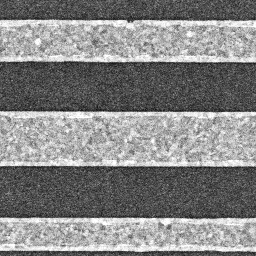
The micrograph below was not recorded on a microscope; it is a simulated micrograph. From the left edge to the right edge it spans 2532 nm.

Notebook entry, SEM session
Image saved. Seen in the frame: one or a few lines or trenches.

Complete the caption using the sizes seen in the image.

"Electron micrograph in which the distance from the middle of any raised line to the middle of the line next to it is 956 nanometers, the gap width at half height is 0.551 microns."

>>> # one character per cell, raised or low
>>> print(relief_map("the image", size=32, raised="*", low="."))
................................
................................
................................
********************************
********************************
********************************
********************************
.......................*........
................................
................................
................................
................................
................................
................................
********************************
********************************
********************************
********************************
********************************
********************************
............................**..
................................
................................
................................
................................
................................
................................
................................
********************************
********************************
********************************
................................